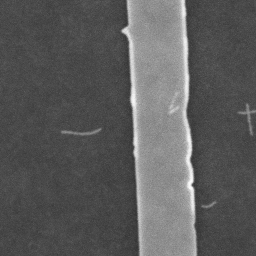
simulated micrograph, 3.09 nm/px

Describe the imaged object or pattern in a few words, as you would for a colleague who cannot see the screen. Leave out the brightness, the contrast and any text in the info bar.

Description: one or a few lines or trenches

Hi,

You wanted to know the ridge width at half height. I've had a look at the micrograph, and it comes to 176 nm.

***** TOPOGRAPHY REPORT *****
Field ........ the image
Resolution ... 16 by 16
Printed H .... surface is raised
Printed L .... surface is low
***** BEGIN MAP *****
LLLLLLLLHHHHLLLL
LLLLLLLLHHHHLLLL
LLLLLLLLHHHHLLLL
LLLLLLLLHHHHLLLL
LLLLLLLLHHHHLLLL
LLLLLLLLHHHHLLLL
LLLLLLLLHHHHLLLL
LLLLLLLLHHHHLLLL
LLLLLLLLHHHHLLLL
LLLLLLLLHHHHLLLL
LLLLLLLLHHHHLLLL
LLLLLLLLLHHHLLLL
LLLLLLLLLHHHLLLL
LLLLLLLLLHHHLLLL
LLLLLLLLLHHHLLLL
LLLLLLLLLHHHLLLL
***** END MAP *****